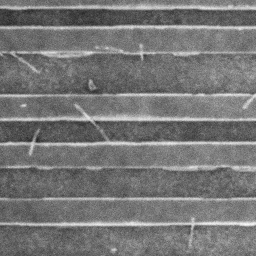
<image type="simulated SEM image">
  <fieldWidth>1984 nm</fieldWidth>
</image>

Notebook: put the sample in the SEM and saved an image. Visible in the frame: lines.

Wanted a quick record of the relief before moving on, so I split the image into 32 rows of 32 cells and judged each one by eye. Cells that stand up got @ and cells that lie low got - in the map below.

@@@@@@@@@@@@@@@@@@@@@@@@@@@@@@@@
--------------------------------
--------------------------------
@@@@@@@@@@@@@@@@@@@@@@@@@@@@@@@@
@@@@@@@@@@@@@@@@@@@@@@@@@@@@@@@@
@@@@@@@@@@@@@@@@@@@@@@@@@@@@@@@@
@@@@@@@---@@@@@@@@@@@@@@@@@@@@@@
--------------------------------
--------------------------------
--------------------------------
--------------------------------
--------------------------------
@@@@@@@@@@@@@@@@@@@@@@@@@@@@@@@@
@@@@@@@@@@@@@@@@@@@@@@@@@@@@@@@@
@@@@@@@@@@@@@@@@@@@@@@@@@@@@@@@@
--------------------------------
--------------------------------
--------------------------------
@@@@@@@@@@@@@@@@@@@@@@@@@@@@@@@@
@@@@@@@@@@@@@@@@@@@@@@@@@@@@@@@@
@@@@@@@@@@@@@@@@@@@@@@@@@@@@@@@@
--------------------------------
--------------------------------
--------------------------------
--------------------------------
@@@@@@@@@@@@@@@@@@@@@@@@@@@@@@@@
@@@@@@@@@@@@@@@@@@@@@@@@@@@@@@@@
@@@@@@@@@@@@@@@@@@@@@@@@@@@@@@@@
--------------------------------
--------------------------------
--------------------------------
--------------------------------